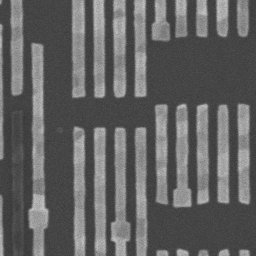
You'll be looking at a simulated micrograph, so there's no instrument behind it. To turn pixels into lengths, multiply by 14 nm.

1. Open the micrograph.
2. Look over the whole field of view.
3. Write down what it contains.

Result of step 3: wiring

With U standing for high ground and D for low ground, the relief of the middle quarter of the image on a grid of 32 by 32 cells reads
DDUUUDDDUUDDDUUDDDUUDDDDDDDDDDDD
DDUUUDDDUUDDDUUDDDUUDDDDDDDDDDDD
DDUUUDDDUUDDDUUDDDUUDDDDDDDDDDDD
DDUUUDDDUUDDDUUDDDUUDDDDDDDDDDDD
DDUUUDDDUUDDDUUDDDUUDDDDDDDDDDDD
DDUUUDDDUUDDDUUDDDUUDDDDDDDDDDDD
DDUUUDDDUUDDDUUDDDUUDDDDDDDDDDDD
DDUUUDDDUUDDDUUDDDUUDDDDDDDDDDDD
DDDDDDDDDDDDDDDDDDDDDDDDDDDDDDDD
DDDDDDDDDDDDDDDDDDDDDDDDDDDDDDDD
DDDDDDDDDDDDDDDDDDDDDDDUUUDDDUUD
DDDDDDDDDDDDDDDDDDDDDDDUUUDDUUUD
DDDDDDDDDDDDDDDDDDDDDDDUUUDDUUUD
DDDDDDDDDDDDDDDDDDDDDDDUUUDDUUUD
DDDDDDDDDDDDDDDDDDDDDDDUUUDDUUUD
DDDDDDDDDDDDDDDDDDDDDDDUUDDDUUUD
DDDUUDDDUUDDDUUDDDUUDDDUUDDDUUUD
DDUUUDDDUUDDDUUDDDUUDDDUUDDDUUUD
DDUUUDDDUUDDDUUDDDUUDDDUUUDDUUUD
DDDUUDDDUUDDDUUDDDUUDDDUUUDDUUUD
DDDUUDDDUUDDDUUDDDUUDDDUUUDDUUUD
DDDUUDDDUUDDDUUDDDUUDDDUUUDDUUUD
DDDUUDDDUUDDDUUDDDUUDDDUUUDDUUUD
DDDUUDDDUUDDDUUDDDUUDDDUUUDDUUUD
DDDUUDDDUUDDDUUDDDUUDDDUUUDDUUUD
DDDUUDDDUUDDDUUDDDUUDDDUUDDDUUUD
DDDUUDDDUUDDDUUDDDUUDDDUUDDDUUUD
DDDUUDDDUUDDDUUDDDUUDDDUUDDDUUUD
DDDUUDDDUUDDDUUDDDUUDDDUUDDDUUUD
DDDUUDDDUUDDDUUDDDUUDDDUUDDDUUUD
DDDUUDDDUUDDDUUDDDUUDDDUUUDDUUUD
DDDUUDDDUUDDDUUDDDUUDDDUUUDDUUUD